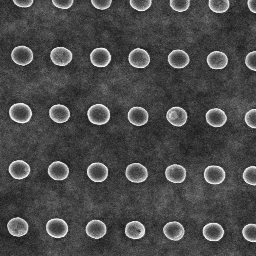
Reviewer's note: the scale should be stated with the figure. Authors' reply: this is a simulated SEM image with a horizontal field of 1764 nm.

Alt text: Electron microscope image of a regular array of raised bodies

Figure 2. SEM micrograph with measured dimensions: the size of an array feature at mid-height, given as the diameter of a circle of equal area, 137 nm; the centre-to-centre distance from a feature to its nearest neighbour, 38.9 px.